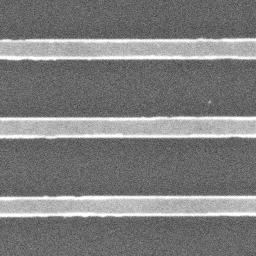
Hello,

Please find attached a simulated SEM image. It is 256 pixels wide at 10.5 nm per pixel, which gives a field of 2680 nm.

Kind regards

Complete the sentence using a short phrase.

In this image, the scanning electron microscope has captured lines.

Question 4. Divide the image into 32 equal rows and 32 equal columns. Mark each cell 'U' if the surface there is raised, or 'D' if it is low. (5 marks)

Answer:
DDDDDDDDDDDDDDDDDDDDDDDDDDDDDDDD
DDDDDDDDDDDDDDDDDDDDDDDDDDDDDDDD
DDDDDDDDDDDDDDDDDDDDDDDDDDDDDDDD
DDDDDDDDDDDDDDDDDDDDDDDDDDDDDDDD
DDDDDDDDDDDDDDDDDDDDDDDDDDDDDDDD
UUUUUUUUUUUUUUUUUUUUUUUUUUUUUUUU
UUUUUUUUUUUUUUUUUUUUUUUUUUUUUUUU
DDDDDDDDDDDDDDDDDDDDDDDDDDDDDDDD
DDDDDDDDDDDDDDDDDDDDDDDDDDDDDDDD
DDDDDDDDDDDDDDDDDDDDDDDDDDDDDDDD
DDDDDDDDDDDDDDDDDDDDDDDDDDDDDDDD
DDDDDDDDDDDDDDDDDDDDDDDDDDDDDDDD
DDDDDDDDDDDDDDDDDDDDDDDDDDDDDDDD
DDDDDDDDDDDDDDDDDDDDDDDDDDDDDDDD
DDDDDDDDDDDDDDDDDDDDDDDDDDDDDDDD
UUUUUUUUUUUUUUUUUUUUUUUUUUUUUUUU
UUUUUUUUUUUUUUUUUUUUUUUUUUUUUUUU
DDDDDDDDDDDDDDDDDDDDDDDDDDDDDDDD
DDDDDDDDDDDDDDDDDDDDDDDDDDDDDDDD
DDDDDDDDDDDDDDDDDDDDDDDDDDDDDDDD
DDDDDDDDDDDDDDDDDDDDDDDDDDDDDDDD
DDDDDDDDDDDDDDDDDDDDDDDDDDDDDDDD
DDDDDDDDDDDDDDDDDDDDDDDDDDDDDDDD
DDDDDDDDDDDDDDDDDDDDDDDDDDDDDDDD
DDDDDDDDDDDDDDDDDDDDDDDDDDDDDDDD
UUUUUUUUUUUUUUUUUUUUUUUUUUUUUUUU
UUUUUUUUUUUUUUUUUUUUUUUUUUUUUUUU
DDDDDDDDDDDDDDDDDDDDDDDDDDDDDDDD
DDDDDDDDDDDDDDDDDDDDDDDDDDDDDDDD
DDDDDDDDDDDDDDDDDDDDDDDDDDDDDDDD
DDDDDDDDDDDDDDDDDDDDDDDDDDDDDDDD
DDDDDDDDDDDDDDDDDDDDDDDDDDDDDDDD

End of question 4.